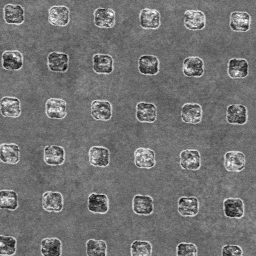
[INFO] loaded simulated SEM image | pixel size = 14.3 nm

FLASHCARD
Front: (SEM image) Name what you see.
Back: a regular array of holes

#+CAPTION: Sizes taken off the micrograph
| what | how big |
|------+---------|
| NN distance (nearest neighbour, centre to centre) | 0.642 um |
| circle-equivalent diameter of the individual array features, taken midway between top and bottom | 289 nanometres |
